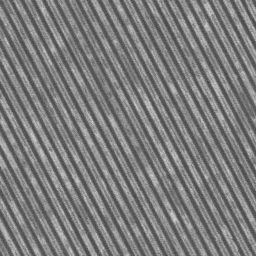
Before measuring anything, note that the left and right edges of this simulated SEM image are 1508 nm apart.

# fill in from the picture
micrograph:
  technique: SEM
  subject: parallel lines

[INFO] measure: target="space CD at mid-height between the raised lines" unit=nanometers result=28.7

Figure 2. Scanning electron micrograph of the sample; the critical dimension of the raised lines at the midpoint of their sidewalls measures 28.7 nanometers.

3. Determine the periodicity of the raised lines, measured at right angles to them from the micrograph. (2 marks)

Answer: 57.6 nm